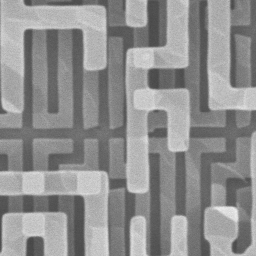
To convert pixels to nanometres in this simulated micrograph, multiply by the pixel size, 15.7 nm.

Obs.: wiring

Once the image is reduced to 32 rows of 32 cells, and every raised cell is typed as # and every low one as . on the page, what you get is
###.............##...##...###...
#############...##...##...###...
#############...##...##...###...
######....###........##...###...
###.......###........##...###...
###........##........##...###...
###........##...#######...###...
###........##...#######...###...
###........##...#######...###...
###.............##........###...
###.............##........###...
###.............#######...######
###.............########..######
###.............########..######
................##...###........
................##...###........
................##...###........
................##...##.........
................##...##........#
................##.............#
................##.............#
#############...##.............#
#############...##..............
##############..##..............
..........###...................
...........##...................
...........##.............####..
########...##...##...##...####..
########...##...##...##...####..
####.###...##...##...##...####..
###...##...###..##...##...###..#
###...##...###..##...##...###..#